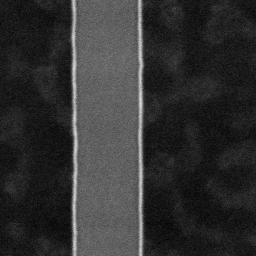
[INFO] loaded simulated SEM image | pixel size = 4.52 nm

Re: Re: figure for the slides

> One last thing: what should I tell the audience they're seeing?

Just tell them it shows one or a few lines or trenches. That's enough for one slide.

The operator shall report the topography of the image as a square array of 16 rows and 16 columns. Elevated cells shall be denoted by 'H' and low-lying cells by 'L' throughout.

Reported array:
HHHHHLLLLHHHHHHH
HHHHHLLLLHHHHHHH
HHHHHLLLLHHHHHHH
HHHHHLLLLHHHHHHH
HHHHHLLLLHHHHHHH
HHHHHLLLLHHHHHHH
HHHHHLLLLHHHHHHH
HHHHHLLLLHHHHHHH
HHHHHLLLLHHHHHHH
HHHHHLLLLHHHHHHH
HHHHHLLLLHHHHHHH
HHHHHLLLLHHHHHHH
HHHHHLLLLHHHHHHH
HHHHHLLLLHHHHHHH
HHHHHLLLLHHHHHHH
HHHHHLLLLHHHHHHH